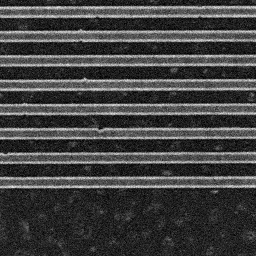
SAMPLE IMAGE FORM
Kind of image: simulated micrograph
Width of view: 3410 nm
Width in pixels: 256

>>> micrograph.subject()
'parallel lines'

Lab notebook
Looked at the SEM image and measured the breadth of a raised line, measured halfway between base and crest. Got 8.75 pixels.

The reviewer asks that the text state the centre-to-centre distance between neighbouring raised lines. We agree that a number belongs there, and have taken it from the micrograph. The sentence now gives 324 nanometers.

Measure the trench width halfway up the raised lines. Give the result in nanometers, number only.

208